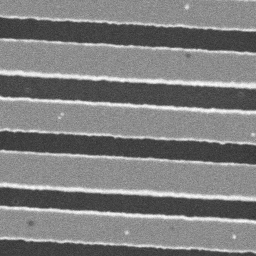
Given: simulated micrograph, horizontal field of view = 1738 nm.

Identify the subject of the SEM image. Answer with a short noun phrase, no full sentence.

lines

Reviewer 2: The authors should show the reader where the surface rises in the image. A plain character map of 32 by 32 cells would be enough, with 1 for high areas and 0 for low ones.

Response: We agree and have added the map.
11111111111111111111111111111111
11111111111111111111111111111111
00000011111111111111111111111111
00000000000000000000000001111111
00000000000000000000000000000000
11111111111111000000000000000000
11111111111111111111111111111100
11111111111111111111111111111111
11111111111111111111111111111111
00001111111111111111111111111111
00000000000000000000001111111111
00000000000000000000000000000000
11111111000000000000000000000000
11111111111111111111111100000000
11111111111111111111111111111111
11111111111111111111111111111111
00001111111111111111111111111111
00000000000000000000111111111111
00000000000000000000000000000000
11111111111000000000000000000000
11111111111111111111111111111100
11111111111111111111111111111111
11111111111111111111111111111111
00011111111111111111111111111111
00000000000000000001111111111111
00000000000000000000000000000000
11111111111110000000000000000000
11111111111111111111111111111110
11111111111111111111111111111111
11111111111111111111111111111111
00000000000001111111111111111111
00000000000000000000000000001111